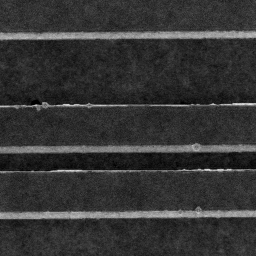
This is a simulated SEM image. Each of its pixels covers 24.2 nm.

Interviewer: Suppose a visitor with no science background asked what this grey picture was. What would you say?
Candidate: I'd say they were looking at lines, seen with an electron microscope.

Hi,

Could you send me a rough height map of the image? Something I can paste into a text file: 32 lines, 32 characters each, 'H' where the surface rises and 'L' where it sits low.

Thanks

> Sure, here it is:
HHHHHHHHHHHHHHHHHHHHHHHHHHHHHHHH
HHHHHHHHHHHHHHHHHHHHHHHHHHHHHHHH
HHHHHHHHHHHHHHHHHHHHHHHHHHHHHHHH
HHHHHHHHHHHHHHHHHHHHHHHHHHHHHHHH
HHHHHHHHHHHHLLLLLLLLLLLLLLLLLLLL
LLLLLLLLLLLLLLLLLLLLLLLLLLLLLLLL
LLLLLLLLLLLLLLLLLLLLLLLLLLLLLLLL
LLLLLLLLLLLLLLLLLLLLLLLLLLLLLLLL
LLLLLLLLLLLLLLLLLLLLLLLLLLLLLLLL
LLLLLLLLLLLLLLLLLLLLLLLLLLLLLLLL
LLLLLLLLLLLLLLLLLLLLLLLLLLLLLLLL
LLLLLLLLLLLLLLLLLLLLLLLLLLLLLLLL
LLLLLLLLLLLLLLLLLLLLLLLLLLLLLLLL
HHHHHHHHHHHHHHHHHHHHHHHHHHHHHHHH
HHHHHHHHHHHHHHHHHHHHHHHHHHHHHHHH
HHHHHHHHHHHHHHHHHHHHHHHHHHHHHHHH
HHHHHHHHHHHHHHHHHHHHHHHHHHHHHHHH
HHHHHHHHHHHHHHHHHHHHHHHHHHHHHHHH
HHHHHHHHHHHHHHHHHHHHHHHHHHHHHHHH
LLLLLLLLLLLLLLLLLLLLLLLLLLLLLLLL
LLLLLLLLLLLLLLLLLLLLLLLLLLLLLLLL
LLLLLLHHHHHHHHHHHHHHHHHHHHHHHHHH
HHHHHHHHHHHHHHHHHHHHHHHHHHHHHHHH
HHHHHHHHHHHHHHHHHHHHHHHHHHHHHHHH
HHHHHHHHHHHHHHHHHHHHHHHHHHHHHHHH
HHHHHHHHHHHHHHHHHHHHHHHHHHHHHHHH
HHHHHHHHHHHHHHHHHHHHHHHHHHHHHHHH
LLLLLLLLLLLLLLLLLLLLLLLLLLLLLLLL
LLLLLLLLLLLLLLLLLLLLLLLLLLLLLLLL
LLLLLLLLLLLLLLLLLLLLLLLLLLLLLLLL
LLLLLLLLLLLLLLLLLLLLLLLLLLLLLLLL
LLLLLLLLLLLLLLLLLLLLLLLLLLLLLLLL